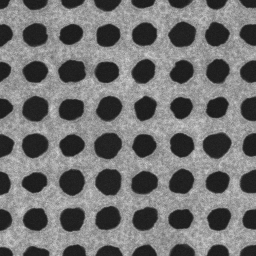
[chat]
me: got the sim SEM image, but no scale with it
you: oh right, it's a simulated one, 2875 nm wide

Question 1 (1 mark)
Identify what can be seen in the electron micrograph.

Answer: a regular array of holes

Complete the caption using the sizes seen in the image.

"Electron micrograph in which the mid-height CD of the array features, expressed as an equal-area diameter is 268 nanometres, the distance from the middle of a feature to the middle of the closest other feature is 403 nm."